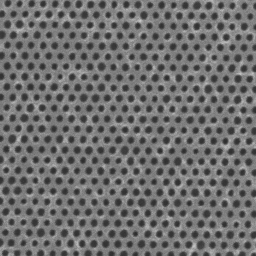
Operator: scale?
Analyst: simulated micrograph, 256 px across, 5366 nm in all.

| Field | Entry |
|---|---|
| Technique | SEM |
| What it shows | a regular array of holes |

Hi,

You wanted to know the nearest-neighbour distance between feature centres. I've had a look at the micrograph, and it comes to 11.6 pixels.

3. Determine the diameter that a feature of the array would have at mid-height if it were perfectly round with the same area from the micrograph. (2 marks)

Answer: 0.159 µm